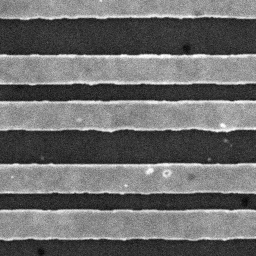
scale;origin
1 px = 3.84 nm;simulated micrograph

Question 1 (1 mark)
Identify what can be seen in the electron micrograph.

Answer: lines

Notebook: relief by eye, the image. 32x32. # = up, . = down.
################################
################################
................................
................................
................................
................................
................................
################################
################################
################################
...##......#....................
................................
................................
################################
################################
################################
................................
................................
................................
................................
................................
################################
################################
################################
................................
................................
################################
################################
################################
################################
................................
................................